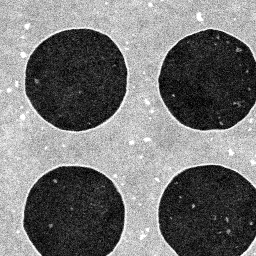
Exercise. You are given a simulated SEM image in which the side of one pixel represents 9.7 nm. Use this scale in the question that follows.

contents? holes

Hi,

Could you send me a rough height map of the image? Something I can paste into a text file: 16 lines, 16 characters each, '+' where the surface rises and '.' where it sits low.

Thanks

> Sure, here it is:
++++++++++++++++
++++++++++++++++
+++....++++....+
++......++......
++......++......
++......++......
++......++......
+++....++++....+
++++++++++++++++
++++++++++++++++
++++..++++++..++
++.....++++.....
++......++......
+.......++......
++......++......
++.....++++....+